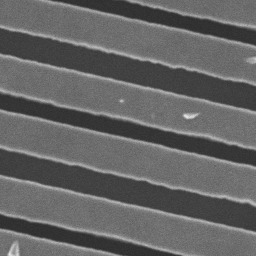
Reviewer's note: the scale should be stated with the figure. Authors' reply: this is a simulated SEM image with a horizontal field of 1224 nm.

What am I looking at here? lines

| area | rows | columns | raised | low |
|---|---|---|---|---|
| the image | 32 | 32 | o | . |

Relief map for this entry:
ooooooooo.........oooooooooooooo
ooooooooooooo.........oooooooooo
oooooooooooooooooo.........ooooo
oooooooooooooooooooooo.........o
.....oooooooooooooooooooooo.....
.........oooooooooooooooooooooo.
.............ooooooooooooooooooo
ooo...............oooooooooooooo
oooooooo...............ooooooooo
oooooooooooo...............ooooo
ooooooooooooooooo..............o
ooooooooooooooooooooo...........
....oooooooooooooooooooooo......
........oooooooooooooooooooooo..
oooo.........ooooooooooooooooooo
oooooooo.........ooooooooooooooo
oooooooooooo.........ooooooooooo
ooooooooooooooooo..........ooooo
ooooooooooooooooooooo.........oo
....oooooooooooooooooooooo......
........oooooooooooooooooooooo..
............oooooooooooooooooooo
oo...............ooooooooooooooo
ooooooo..............ooooooooooo
ooooooooooo...............oooooo
oooooooooooooooo...............o
ooooooooooooooooooooo...........
...ooooooooooooooooooooooo......
........oooooooooooooooooooooo..
oooo.........ooooooooooooooooooo
ooooooooo........ooooooooooooooo
oooooooooooooo.......ooooooooooo